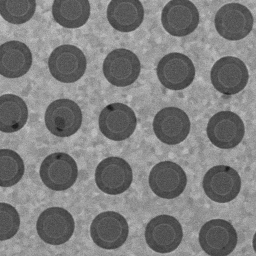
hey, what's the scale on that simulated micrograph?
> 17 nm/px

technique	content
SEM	an array of small figures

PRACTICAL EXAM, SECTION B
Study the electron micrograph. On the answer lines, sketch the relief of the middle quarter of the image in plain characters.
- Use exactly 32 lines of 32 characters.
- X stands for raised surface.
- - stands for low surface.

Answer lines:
XXX---XXXX--XXXXX--XXXX--XXXXXX-
XXX--XXXXX--XXXXX--XXXX--XXXXXX-
-----XXXXX--XXXX---XXXX--XXXXXX-
----XXXXXX---XX---XXXXX---XXXX--
---XXXXXXXX-------XXXXXX---XX---
XXXXXXXXXXXXX---XXXXXXXXX------X
XXXXXXXXXXXXXXXXXXXXXXXXXXX--XXX
XXXXXXXXXXXXXXXXXXXXXXXXXXXXXXXX
XXXXXXXXXXXXXXXXXXXXXXXXXXXXXXXX
---XXXXXXXXXXXXXXXXXXXXXXXXXXXXX
----XXXXXX------XXXXXXXXXXXXXXXX
XX--XXXXXX-------XXXXXXX------XX
XX---XXXX--XXXX---XXXXX--------X
XX---XXXX--XXXXX--XXXX----XXX--X
XX---XXX---XXXXX--XXXX---XXXX---
XX--XXXXX--XXXXX--XXXX---XXXX---
----XXXXX---XXX---XXXX---XXXX---
---XXXXXXX-------XXXXXX--XXXX--X
XXXXXXXXXXX-----XXXXXXX--------X
XXXXXXXXXXXXXXXXXXXXXXXX------XX
XXXXXXXXXXXXXXXXXXXXXXXXXXXXXXXX
XXXXXXXXXXXXXXXXXXXXXXXXXXXXXXXX
-XXXXXXXXXXXXXXXXXXXXXXXXXXXXXXX
--XXXXXXXX----XXXXXXXXXXXXXXXXXX
---XXXXXX-------XXXXXXXX---XXXXX
X--XXXXX---XXX---XXXXX-------XXX
XX--XXXX--XXXXX--XXXXX---XX---XX
XX--XXXX--XXXXX--XXXX--XXXXX--XX
X--XXXXX--XXXXX--XXXX--XXXXXX--X
---XXXXX--XXXXX--XXXX--XXXXXX--X
--XXXXXX---XXX---XXXX---XXXX---X
XXXXXXXXX-------XXXXXX---XX---XX